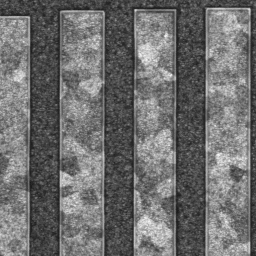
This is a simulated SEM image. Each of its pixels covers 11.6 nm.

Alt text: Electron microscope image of one or a few lines or trenches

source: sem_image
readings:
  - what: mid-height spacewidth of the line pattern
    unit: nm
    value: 366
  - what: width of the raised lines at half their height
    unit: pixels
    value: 40.6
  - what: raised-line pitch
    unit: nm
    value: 844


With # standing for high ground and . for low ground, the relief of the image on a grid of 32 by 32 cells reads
................................
........#####....#####....#####.
####....#####....#####....#####.
####....#####....#####....#####.
####....#####....#####....#####.
####....#####....#####....#####.
####....#####....#####....#####.
####....#####....#####....#####.
####....#####....#####....#####.
####....#####....#####....#####.
####....#####....#####....#####.
####....#####....#####....#####.
####....#####....#####....#####.
####....#####....#####....#####.
####....#####....#####....#####.
####....#####....#####....#####.
####....#####....#####....#####.
####....#####....#####....#####.
####....#####....#####....#####.
####....#####....#####....#####.
####....#####....#####....#####.
####....#####....#####....#####.
####....#####....#####....#####.
###.....#####....#####....#####.
###.....#####....#####....#####.
###.....#####....#####....#####.
###.....#####....#####....#####.
###.....#####....#####....#####.
###.....#####....#####....#####.
###.....#####....#####....#####.
###.....#####....#####....#####.
###.....#####....#####....#####.